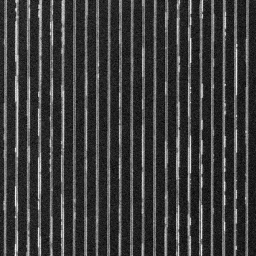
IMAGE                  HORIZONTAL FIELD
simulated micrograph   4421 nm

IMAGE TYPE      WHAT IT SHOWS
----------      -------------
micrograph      parallel lines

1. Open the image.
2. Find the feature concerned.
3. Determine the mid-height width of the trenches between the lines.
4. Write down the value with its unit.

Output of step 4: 0.16 µm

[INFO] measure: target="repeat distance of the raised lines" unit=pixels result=11.5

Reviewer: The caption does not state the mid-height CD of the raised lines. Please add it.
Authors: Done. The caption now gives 38.9 nanometers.